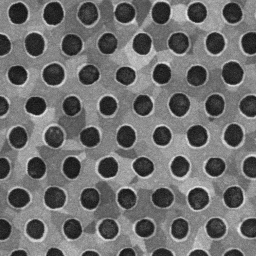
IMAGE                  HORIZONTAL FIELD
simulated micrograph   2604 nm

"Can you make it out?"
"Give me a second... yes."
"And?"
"a regular array of holes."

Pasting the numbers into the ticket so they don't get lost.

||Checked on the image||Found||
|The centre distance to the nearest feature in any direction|0.354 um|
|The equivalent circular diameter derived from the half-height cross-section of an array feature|217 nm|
